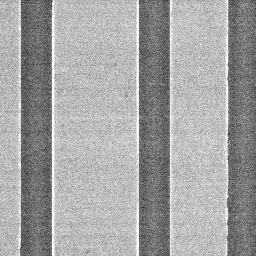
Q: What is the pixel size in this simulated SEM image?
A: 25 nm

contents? lines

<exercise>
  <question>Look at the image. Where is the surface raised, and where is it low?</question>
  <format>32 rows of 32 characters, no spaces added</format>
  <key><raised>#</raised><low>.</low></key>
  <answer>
##.....##########....#######....
##.....##########....#######....
##.....##########....#######....
##.....##########....#######....
##.....##########....#######....
##.....##########....#######....
##.....##########....#######....
##.....##########....#######....
##.....##########....#######....
##.....##########....#######....
##.....##########....#######....
##.....##########....#######....
##.....##########....#######....
##.....##########....#######....
##.....##########....#######....
##.....##########....#######....
##.....##########....#######....
##.....##########....#######....
##.....##########....#######....
##.....##########....#######....
##.....##########....#######....
##.....##########....#######....
##.....##########....#######....
##.....##########....#######....
##.....##########....#######....
##.....##########....#######....
##.....##########....#######....
##.....##########....#######....
##.....##########....#######....
##.....##########....#######....
##.....##########....#######....
##.....##########....#######....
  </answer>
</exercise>